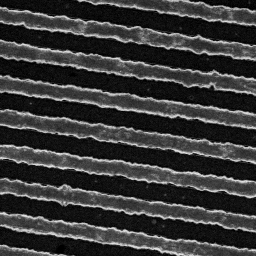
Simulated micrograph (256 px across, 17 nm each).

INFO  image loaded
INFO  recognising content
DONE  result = parallel lines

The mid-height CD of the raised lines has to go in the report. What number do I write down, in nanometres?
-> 229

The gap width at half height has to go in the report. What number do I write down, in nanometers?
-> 343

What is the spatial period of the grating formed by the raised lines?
574 nm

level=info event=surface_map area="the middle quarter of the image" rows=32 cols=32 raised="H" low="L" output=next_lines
LLLHHHHHHHHHHHHHHHHHHHLLLLLLLLLL
LLLLLLLHHHHHHHHHHHHHHHHHHHHHHLLL
LLLLLLLLLLLLLLHHHHHHHHHHHHHHHHHH
LLLLLLLLLLLLLLLLLLLHHHHHHHHHHHHH
LLLLLLLLLLLLLLLLLLLLLLLLLLLLHHHH
LLLLLLLLLLLLLLLLLLLLLLLLLLLLLLLH
HHHHHHHHLLLLLLLLLLLLLLLLLLLLLLLL
HHHHHHHHHHHLLLHHLLLLLLLLLLLLLLLL
HHHHHHHHHHHHHHHHHHHLLLLLLLLLLLLL
LLLLLLHHHHHHHHHHHHHHHHHHHHHLLLLL
LLLLLLLLLHHHHHHHHHHHHHHHHHHHHHHH
LLLLLLLLLLLLLLLLHHHHHHHHHHHHHHHH
LLLLLLLLLLLLLLLLLLLLLLLLHHHHHHHH
LLLLLLLLLLLLLLLLLLLLLLLLLLLLLLLH
HHHLLLLLLLLLLLLLLLLLLLLLLLLLLLLL
HHHHHHHHHHLLLLLLLLLLLLLLLLLLLLLL
HHHHHHHHHHHHHHHHHLLLLLLLLLLLLLLL
HHHHHHHHHHHHHHHHHHHHHHHLLLLLLLLL
LLLLLLLLHHHHHHHHHHHHHHHHHHHHHHLL
LLLLLLLLLLLLLLLHHHHHHHHHHHHHHHHH
LLLLLLLLLLLLLLLLLLLHHHHHHHHHHHHH
LLLLLLLLLLLLLLLLLLLLLLLLLLLLHHHH
LLLLLLLLLLLLLLLLLLLLLLLLLLLLLLLL
HHHHLLLLLLLLLLLLLLLLLLLLLLLLLLLL
HHHHHHHHHHHHHHHLLLLLLLLLLLLLLLLL
HHHHHHHHHHHHHHHHHHHHHLLLLLLLLLLL
LLLLHHHHHHHHHHHHHHHHHHHHHHLLLLLL
LLLLLLLLLLLHHHHHHHHHHHHHHHHHHHHH
LLLLLLLLLLLLLLLLHHHHHHHHHHHHHHHH
LLLLLLLLLLLLLLLLLLLLLLLLHHHHHHHH
LLLLLLLLLLLLLLLLLLLLLLLLLLLLLHHL
HHLHLLLLLLLLLLLLLLLLLLLLLLLLLLLL